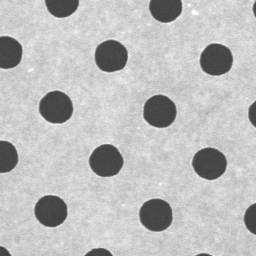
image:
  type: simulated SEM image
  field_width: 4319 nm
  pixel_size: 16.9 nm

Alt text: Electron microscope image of a regular array of holes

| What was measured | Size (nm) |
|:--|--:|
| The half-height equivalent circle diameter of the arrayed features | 566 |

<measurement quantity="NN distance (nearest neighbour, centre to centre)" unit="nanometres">1240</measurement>